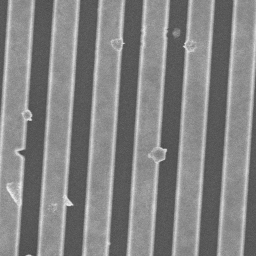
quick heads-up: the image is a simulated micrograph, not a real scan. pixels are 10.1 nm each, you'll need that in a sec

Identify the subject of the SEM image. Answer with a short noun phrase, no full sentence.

parallel lines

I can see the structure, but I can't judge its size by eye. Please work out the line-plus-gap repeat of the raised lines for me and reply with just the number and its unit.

0.452 microns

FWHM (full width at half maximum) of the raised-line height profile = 0.251 µm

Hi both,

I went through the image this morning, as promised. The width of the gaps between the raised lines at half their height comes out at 0.203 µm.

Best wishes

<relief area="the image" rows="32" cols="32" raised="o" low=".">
.ooo...ooo..ooo...ooo...ooo..ooo
.ooo...ooo..ooo...ooo...ooo..ooo
.ooo...ooo..ooo...ooo..oooo..ooo
.ooo...ooo..ooo...ooo..ooo...ooo
.ooo...ooo..ooo...ooo..ooo...ooo
.ooo...oo...ooo...ooo..ooo...ooo
.ooo..ooo...ooo...ooo..ooo...ooo
.ooo..ooo...ooo...ooo..ooo...ooo
.ooo..ooo...ooo...ooo..ooo...ooo
.ooo..ooo...ooo..ooo...ooo...ooo
.oo...ooo...ooo..ooo...ooo...ooo
ooo...ooo...ooo..ooo...ooo...ooo
ooo...ooo...ooo..ooo...ooo...ooo
ooo...ooo...ooo..ooo...ooo..oooo
oooo..ooo...ooo..ooo...ooo..ooo.
ooo...ooo..oooo..ooo...ooo..ooo.
ooo...ooo..ooo...ooo...ooo..ooo.
ooo...ooo..ooo...ooo...ooo..ooo.
ooo...ooo..ooo...ooo..oooo..ooo.
ooo...ooo..ooo...oooo.ooo...ooo.
ooo...ooo..ooo...ooo..ooo...ooo.
ooo..ooo...ooo...ooo..ooo...ooo.
ooo..ooo...ooo...ooo..ooo...ooo.
ooo..ooo...ooo...ooo..ooo...ooo.
ooo..ooo...ooo...oo...ooo...ooo.
ooo..oooo..ooo..ooo...ooo...ooo.
oo...ooo...ooo..ooo...ooo...ooo.
oo...ooo...ooo..ooo...ooo...ooo.
oo...ooo...ooo..ooo...ooo..oooo.
oo...ooo...ooo..ooo...ooo..ooo..
oo...ooo..oooo..ooo...ooo..ooo..
oo...ooo..ooo...ooo...ooo..ooo..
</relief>